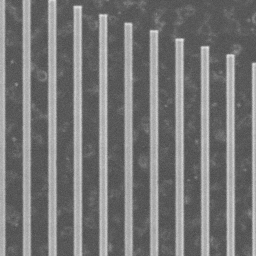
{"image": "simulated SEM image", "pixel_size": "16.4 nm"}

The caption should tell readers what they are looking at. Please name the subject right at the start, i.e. parallel lines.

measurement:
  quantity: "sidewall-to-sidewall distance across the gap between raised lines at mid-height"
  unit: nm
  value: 306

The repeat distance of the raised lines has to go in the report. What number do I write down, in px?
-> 25.5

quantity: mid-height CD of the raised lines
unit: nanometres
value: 111